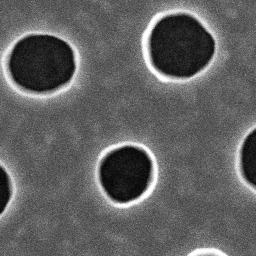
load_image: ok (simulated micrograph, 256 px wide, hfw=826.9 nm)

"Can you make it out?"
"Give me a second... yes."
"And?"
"holes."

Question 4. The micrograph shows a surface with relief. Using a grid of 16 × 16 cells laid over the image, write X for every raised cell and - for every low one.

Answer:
XXXXXXXXXXXXXXXX
XXXXXXXXXX---XXX
X---XXXXX----XXX
X----XXXX----XXX
X----XXXXX--XXXX
X---XXXXXXXXXXXX
XXXXXXXXXXXXXXXX
XXXXXXXXXXXXXXXX
XXXXXXXXXXXXXXX-
XXXXXXX--XXXXXX-
XXXXXX---XXXXXX-
-XXXXX---XXXXXXX
-XXXXXX-XXXXXXXX
XXXXXXXXXXXXXXXX
XXXXXXXXXXXXXXXX
XXXXXXXXXXXXXXXX